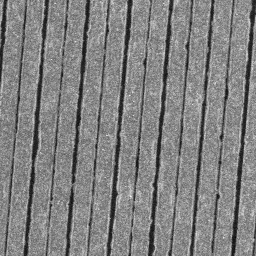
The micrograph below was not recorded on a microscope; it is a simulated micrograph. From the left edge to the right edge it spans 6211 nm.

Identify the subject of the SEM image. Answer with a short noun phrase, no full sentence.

parallel lines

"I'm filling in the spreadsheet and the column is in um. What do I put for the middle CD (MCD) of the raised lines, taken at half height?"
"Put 0.39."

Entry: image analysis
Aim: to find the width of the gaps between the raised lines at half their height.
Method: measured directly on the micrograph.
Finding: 127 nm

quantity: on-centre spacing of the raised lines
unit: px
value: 20.6